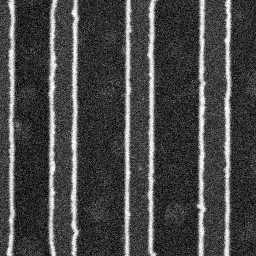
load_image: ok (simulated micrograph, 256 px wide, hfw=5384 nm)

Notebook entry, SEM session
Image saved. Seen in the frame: one or a few lines or trenches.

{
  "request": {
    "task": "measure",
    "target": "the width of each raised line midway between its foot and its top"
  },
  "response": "514 nm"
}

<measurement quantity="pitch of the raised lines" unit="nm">1590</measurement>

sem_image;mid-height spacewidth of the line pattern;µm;1.05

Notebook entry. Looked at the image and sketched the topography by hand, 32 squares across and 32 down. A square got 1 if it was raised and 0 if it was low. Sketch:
11000001100000001110000001111000
11000001100000001110000001111000
11000001110000001110000001111000
11000001100000001110000001111000
10000011100000001110000001110000
10000011100000001110000001110000
10000011100000001110000001110000
10000001100000001110000001110000
10000001100000001110000001110000
11000011100000001110000001111000
11000011100000001110000001111000
11000011100000001110000001111000
11000011100000001110000001110000
10000011100000001110000001110000
10000011100000001110000001110000
10000001100000001110000001110000
10000011100000001110000001110000
11000001100000001110000001111000
11000011100000001110000001110000
11000011100000001110000001110000
11000011100000001110000001111000
10000011100000001110000001110000
10000011100000001110000001110000
10000011100000001110000001110000
10000011100000001110000001110000
10000011100000001110000001110000
11000001100000001110000001110000
10000011100000001110000001110000
10000011100000001110000001110000
10000011100000001110000001110000
10000011100000001110000001110000
10000001100000001110000001110000